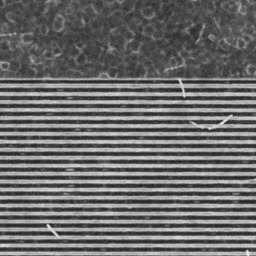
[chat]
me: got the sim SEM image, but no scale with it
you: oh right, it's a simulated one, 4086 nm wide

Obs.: parallel lines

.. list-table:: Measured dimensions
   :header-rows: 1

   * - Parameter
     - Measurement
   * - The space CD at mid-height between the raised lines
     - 5.13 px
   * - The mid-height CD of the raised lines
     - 41.9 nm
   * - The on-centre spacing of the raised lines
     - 128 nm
